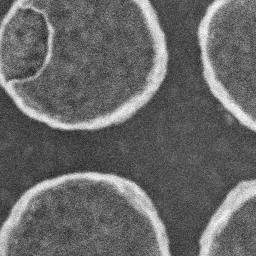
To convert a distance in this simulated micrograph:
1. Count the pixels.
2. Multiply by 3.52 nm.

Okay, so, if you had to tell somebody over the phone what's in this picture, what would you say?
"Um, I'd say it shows raised bodies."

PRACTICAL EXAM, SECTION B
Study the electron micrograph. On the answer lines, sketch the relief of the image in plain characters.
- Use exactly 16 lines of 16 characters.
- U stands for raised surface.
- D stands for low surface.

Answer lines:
DUUUUUUUUDDDDUUU
UUUUUUUUUUDDDUUU
UUUUUUUUUUDDDUUU
UUUUUUUUUUDDDUUU
UUUUUUUUUUDDDUUU
UUUUUUUUUDDDDUUU
DUUUUUUUDDDDDDUU
DDDUUUUDDDDDDDDU
DDDDDDDDDDDDDDDD
DDDDDDDDDDDDDDDD
DDDDDDDDDDDDDDDD
DDDUUUUUDDDDDDDD
DDUUUUUUUDDDDDDU
DUUUUUUUUUDDDDUU
UUUUUUUUUUDDDUUU
UUUUUUUUUUDDDUUU